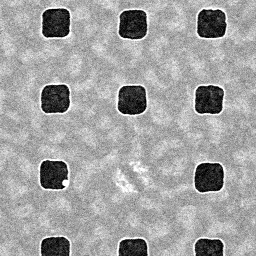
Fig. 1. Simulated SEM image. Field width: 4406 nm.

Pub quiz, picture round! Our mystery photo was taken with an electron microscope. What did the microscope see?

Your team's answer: a regular array of holes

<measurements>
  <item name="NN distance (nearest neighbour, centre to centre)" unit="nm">1300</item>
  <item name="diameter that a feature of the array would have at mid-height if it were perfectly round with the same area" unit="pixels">31.4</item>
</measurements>